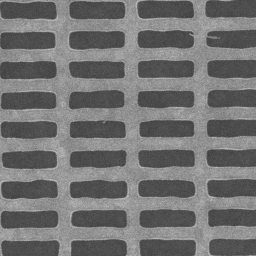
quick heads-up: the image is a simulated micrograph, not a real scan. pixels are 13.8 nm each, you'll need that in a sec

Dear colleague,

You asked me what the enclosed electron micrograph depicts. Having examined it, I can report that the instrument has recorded groups of lines, slits or small figures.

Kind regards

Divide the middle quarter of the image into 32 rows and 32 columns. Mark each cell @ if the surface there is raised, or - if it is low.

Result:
@--------------@@@--------------
@--------------@@@--------------
@--------------@@@--------------
@@@------------@@@@------------@
@@@@@@@@@@@@@@@@@@@@@@@@@@@@@@@@
@@@@@@@@@@@@@@@@@@@@@@@@@@@@@@@@
@@@@@@@@@----@@@@@@@@@-----@@@@@
@@-------------@@@--------------
@--------------@@@--------------
@--------------@@@--------------
@--------------@@@@-------------
@@-@@@@@@@@@@@@@@@@@@@@@@@@@@@@@
@@@@@@@@@@@@@@@@@@@@@@@@@@@@@@@@
@@@@@@@@@@@@@@@@@@@@@@@@@@@@@@@@
@@-------------@@@@-------------
@--------------@@@@-------------
@--------------@@@@-------------
@---------------@@@-------------
@@-------------@@@@@@@@@@@@@@@@@
@@@@@@@@@@@@@@@@@@@@@@@@@@@@@@@@
@@@@@@@@@@@@@@@@@@@@@@@@@@@@@@@@
@@@@@----------@@@@-------------
@@--------------@@--------------
@---------------@@--------------
@---------------@@--------------
@@-------------@@@@-------------
@@@@@@@@@@@@@@@@@@@@@@@@@@@@@@@@
@@@@@@@@@@@@@@@@@@@@@@@@@@@@@@@@
@@@@@@@@@@@@@@@@@@@@@@@@@@@@@@@@
@@--------------@@@-------------
@---------------@@--------------
@---------------@@--------------